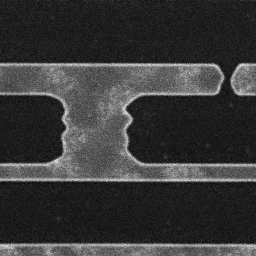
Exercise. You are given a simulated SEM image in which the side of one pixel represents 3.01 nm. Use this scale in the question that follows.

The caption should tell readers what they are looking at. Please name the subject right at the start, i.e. one or a few lines or trenches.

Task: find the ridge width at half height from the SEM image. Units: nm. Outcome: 69.2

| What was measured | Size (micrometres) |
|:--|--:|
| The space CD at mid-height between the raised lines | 0.195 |